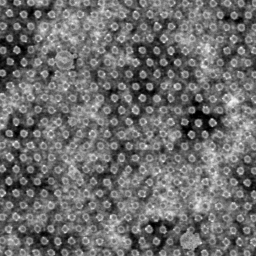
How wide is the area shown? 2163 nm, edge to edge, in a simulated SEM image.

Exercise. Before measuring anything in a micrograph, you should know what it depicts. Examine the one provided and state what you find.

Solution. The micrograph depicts a regular array of raised bodies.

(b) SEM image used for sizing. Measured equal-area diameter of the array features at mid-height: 0.054 micrometres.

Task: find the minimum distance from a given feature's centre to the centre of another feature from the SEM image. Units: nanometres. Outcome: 113